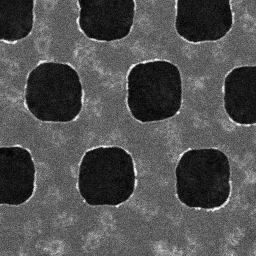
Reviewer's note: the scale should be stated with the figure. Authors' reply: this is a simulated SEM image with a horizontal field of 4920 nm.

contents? holes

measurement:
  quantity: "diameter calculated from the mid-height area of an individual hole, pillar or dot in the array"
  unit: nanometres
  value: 1160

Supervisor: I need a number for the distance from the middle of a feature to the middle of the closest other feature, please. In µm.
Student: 1.87